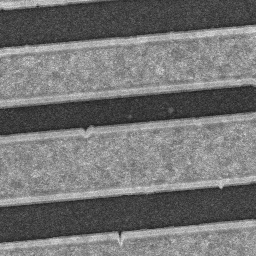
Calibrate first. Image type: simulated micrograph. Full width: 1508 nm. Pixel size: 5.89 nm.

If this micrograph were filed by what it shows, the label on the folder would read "one or a few lines or trenches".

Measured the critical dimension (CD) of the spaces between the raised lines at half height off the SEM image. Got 258 nanometres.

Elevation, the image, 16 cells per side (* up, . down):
................
................
.........*******
****************
****************
***********.....
................
..............**
...*************
****************
****************
*************...
**..............
................
..........******
****************